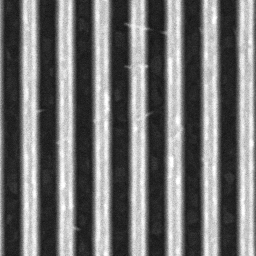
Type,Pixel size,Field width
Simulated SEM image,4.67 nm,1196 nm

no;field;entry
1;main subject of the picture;parallel lines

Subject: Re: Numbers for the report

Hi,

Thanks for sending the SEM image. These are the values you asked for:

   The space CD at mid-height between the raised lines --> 92.9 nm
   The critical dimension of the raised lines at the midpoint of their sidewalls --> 15.9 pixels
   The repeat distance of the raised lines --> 169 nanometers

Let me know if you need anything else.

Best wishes